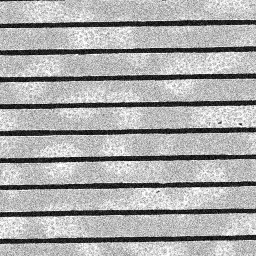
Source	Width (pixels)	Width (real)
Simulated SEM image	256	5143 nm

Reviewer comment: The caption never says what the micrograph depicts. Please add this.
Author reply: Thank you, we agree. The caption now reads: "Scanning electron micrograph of parallel lines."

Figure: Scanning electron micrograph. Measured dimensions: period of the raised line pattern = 541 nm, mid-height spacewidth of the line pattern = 113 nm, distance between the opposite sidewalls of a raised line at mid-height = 427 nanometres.